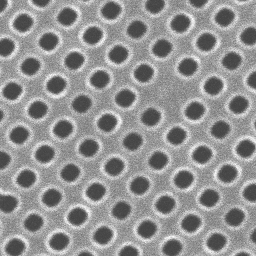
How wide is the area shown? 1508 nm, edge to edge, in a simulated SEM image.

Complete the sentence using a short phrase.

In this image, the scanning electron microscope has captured a regular array of holes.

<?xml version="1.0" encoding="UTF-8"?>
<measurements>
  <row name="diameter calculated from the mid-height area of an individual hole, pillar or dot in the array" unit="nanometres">105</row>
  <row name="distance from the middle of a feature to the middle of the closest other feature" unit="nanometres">182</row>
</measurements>